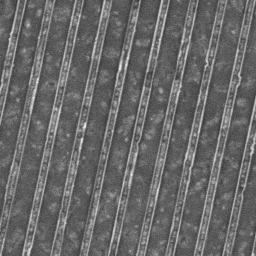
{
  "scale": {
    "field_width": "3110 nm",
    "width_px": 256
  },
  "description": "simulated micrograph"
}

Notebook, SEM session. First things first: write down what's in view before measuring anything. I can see parallel lines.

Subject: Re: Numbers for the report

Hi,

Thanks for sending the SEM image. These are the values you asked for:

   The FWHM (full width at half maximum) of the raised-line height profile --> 89.2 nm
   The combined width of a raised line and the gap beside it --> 342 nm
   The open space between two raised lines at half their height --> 0.254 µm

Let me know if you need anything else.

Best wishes